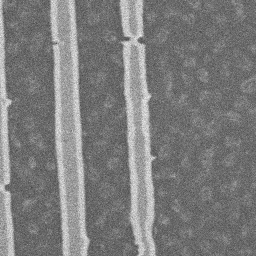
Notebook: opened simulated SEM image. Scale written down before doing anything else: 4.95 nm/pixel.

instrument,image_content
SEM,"one or a few lines or trenches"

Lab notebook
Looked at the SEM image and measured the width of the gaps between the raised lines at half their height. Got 262 nm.